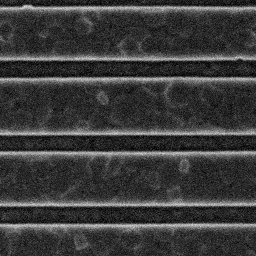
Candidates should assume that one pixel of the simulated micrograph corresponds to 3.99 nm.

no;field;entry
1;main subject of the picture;one or a few lines or trenches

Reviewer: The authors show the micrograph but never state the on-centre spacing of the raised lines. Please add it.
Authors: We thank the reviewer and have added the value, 72.9 px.